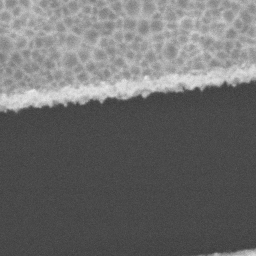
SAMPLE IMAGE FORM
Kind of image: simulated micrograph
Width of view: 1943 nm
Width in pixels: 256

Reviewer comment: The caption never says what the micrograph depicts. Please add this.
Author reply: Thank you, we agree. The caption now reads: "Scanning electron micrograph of one or a few lines or trenches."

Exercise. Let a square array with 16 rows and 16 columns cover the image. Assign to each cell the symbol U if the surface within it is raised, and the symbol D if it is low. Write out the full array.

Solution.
UUUUUUUUUUUUUUUU
UUUUUUUUUUUUUUUU
UUUUUUUUUUUUUUUU
UUUUUUUUUUUUUUUU
UUUUUUUUUUUUUUUU
UUUUUUUUDDDDDDDD
DDDDDDDDDDDDDDDD
DDDDDDDDDDDDDDDD
DDDDDDDDDDDDDDDD
DDDDDDDDDDDDDDDD
DDDDDDDDDDDDDDDD
DDDDDDDDDDDDDDDD
DDDDDDDDDDDDDDDD
DDDDDDDDDDDDDDDD
DDDDDDDDDDDDDDDD
DDDDDDDDDDDDDDDD